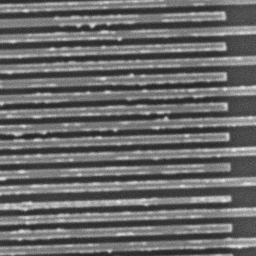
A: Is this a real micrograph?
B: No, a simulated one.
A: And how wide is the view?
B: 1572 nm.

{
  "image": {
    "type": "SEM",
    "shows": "parallel lines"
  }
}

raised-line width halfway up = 49.1 nanometres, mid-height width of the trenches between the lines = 43.7 nm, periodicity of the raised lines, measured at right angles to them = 93.2 nm